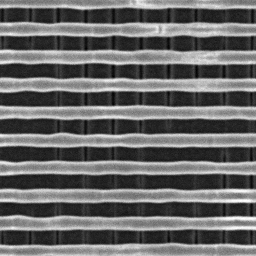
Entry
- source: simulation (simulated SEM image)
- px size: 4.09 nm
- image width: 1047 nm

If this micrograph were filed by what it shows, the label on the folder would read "wiring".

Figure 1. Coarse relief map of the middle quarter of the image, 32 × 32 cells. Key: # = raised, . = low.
................................
................................
................................
................................
################################
################################
###########..############....###
................................
................................
................................
................#####...........
################################
################################
#########......#######.......##.
................................
................................
................................
##..............###........####.
################################
################################
###.............####.......####.
................................
................................
................................
###################.........####
################################
################################
................................
................................
................................
................................
##########.##################...